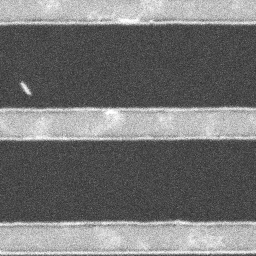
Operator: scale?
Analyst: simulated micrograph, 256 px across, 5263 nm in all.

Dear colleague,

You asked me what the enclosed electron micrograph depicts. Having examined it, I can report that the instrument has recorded one or a few lines or trenches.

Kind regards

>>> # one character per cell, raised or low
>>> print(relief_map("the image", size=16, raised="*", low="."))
................
****************
****************
****************
****************
****************
****************
................
................
****************
****************
****************
****************
****************
................
................